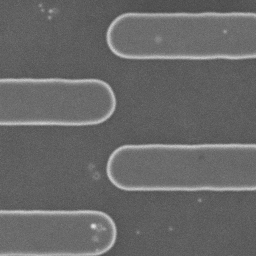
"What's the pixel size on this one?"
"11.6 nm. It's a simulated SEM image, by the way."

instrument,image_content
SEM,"groups of lines, slits or small figures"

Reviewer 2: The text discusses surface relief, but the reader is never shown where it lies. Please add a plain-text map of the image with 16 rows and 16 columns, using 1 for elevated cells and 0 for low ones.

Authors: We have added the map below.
0000000000000000
0000000111111111
0000000111111111
0000000011111111
0000000000000000
1111111000000000
1111111000000000
1111110000000000
0000000000000000
0000000111111111
0000000111111111
0000000111111111
0000000000000000
1111111000000000
1111111000000000
1111111000000000